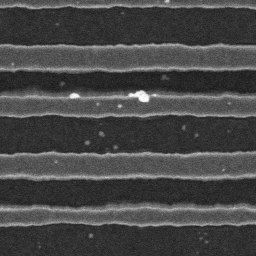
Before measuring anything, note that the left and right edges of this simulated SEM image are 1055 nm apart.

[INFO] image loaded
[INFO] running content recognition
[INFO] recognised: lines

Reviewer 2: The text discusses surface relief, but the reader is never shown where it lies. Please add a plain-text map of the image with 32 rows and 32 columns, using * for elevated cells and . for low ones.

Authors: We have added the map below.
********************************
................................
................................
................................
................................
................................
********************************
********************************
********************************
................................
................................
.................*..............
********************************
********************************
****....***********.....**.*****
................................
................................
................................
................................
********************************
********************************
********************************
................................
................................
................................
................................
********************************
********************************
................................
................................
................................
................................